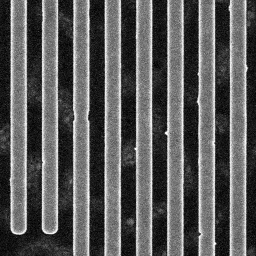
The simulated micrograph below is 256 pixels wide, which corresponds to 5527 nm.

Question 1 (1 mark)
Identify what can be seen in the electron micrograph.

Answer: parallel lines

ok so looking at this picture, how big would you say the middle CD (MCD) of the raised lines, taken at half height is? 329 nanometers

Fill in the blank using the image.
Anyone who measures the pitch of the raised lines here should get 677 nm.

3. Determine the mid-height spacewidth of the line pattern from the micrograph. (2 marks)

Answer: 0.343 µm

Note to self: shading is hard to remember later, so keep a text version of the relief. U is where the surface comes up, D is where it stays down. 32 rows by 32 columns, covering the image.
DUUDDUUDDUUDDUUDDUUDDUUDDUUDDUUD
DUUDDUUDDUUDDUUDDUUDDUUDDUUDDUUD
DUUDDUUDDUUDDUUDDUUDDUUDDUUDDUUD
DUUDDUUDDUUDDUUDDUUDDUUDDUUDDUUD
DUUDDUUDDUUDDUUDDUUDDUUDDUUDDUUD
DUUDDUUDDUUDDUUDDUUDDUUDDUUDDUUD
DUUDDUUDDUUDDUUDDUUDDUUDDUUDDUUD
DUUDDUUDDUUDDUUDDUUDDUUDDUUDDUUD
DUUDDUUDDUUDDUUDDUUDDUUDDUUDDUUD
DUUDDUUDDUUDDUUDDUUDDUUDDUUDDUUD
DUUDDUUDDUUDDUUDDUUDDUUDDUUDDUUD
DUUDDUUDDUUDDUUDDUUDDUUDDUUDDUUD
DUUDDUUDDUUDDUUDDUUDDUUDDUUDDUUD
DUUDDUUDDUUDDUUDDUUDDUUDDUUDDUUD
DUUDDUUDDUUDDUUDDUUDDUUDDUUDDUUD
DUUDDUUDDUUDDUUDDUUDDUUDDUUDDUUD
DUUDDUUDDUUDDUUDDUUDDUUDDUUDDUUD
DUUDDUUDDUUDDUUDDUUDDUUDDUUDDUUD
DUUDDUUDDUUDDUUDDUUDDUUDDUUDDUUD
DUUDDUUDDUUDDUUDDUUDDUUDDUUDDUUD
DUUDDUUDDUUDDUUDDUUDDUUDDUUDDUUD
DUUDDUUDDUUDDUUDDUUDDUUDDUUDDUUD
DUUDDUUDDUUDDUUDDUUDDUUDDUUDDUUD
DUUDDUUDDUUDDUUDDUUDDUUDDUUDDUUD
DUUDDUUDDUUDDUUDDUUDDUUDDUUDDUUD
DUUDDUUDDUUDDUUDDUUDDUUDDUUDDUUD
DUUDDUUDDUUDDUUDDUUDDUUDDUUDDUUD
DUUDDUUDDUUDDUUDDUUDDUUDDUUDDUUD
DUUDDUUDDUUDDUUDDUUDDUUDDUUDDUUD
DDDDDDDDDUUDDUUDDUUDDUUDDUUDDUUD
DDDDDDDDDUUDDUUDDUUDDUUDDUUDDUUD
DDDDDDDDDUUDDUUDDUUDDUUDDUUDDUUD